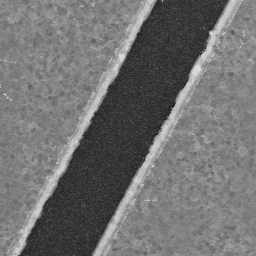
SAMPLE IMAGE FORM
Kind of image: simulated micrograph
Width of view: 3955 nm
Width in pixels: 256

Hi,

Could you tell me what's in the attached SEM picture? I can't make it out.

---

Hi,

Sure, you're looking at one or a few lines or trenches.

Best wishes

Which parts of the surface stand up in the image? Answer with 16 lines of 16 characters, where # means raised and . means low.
#########.....##
#########.....##
########.....###
########.....###
#######.....####
#######.....####
######.....#####
#####......#####
#####.....######
####......######
####.....#######
###.....########
###.....########
##.....#########
##.....#########
#.....##########